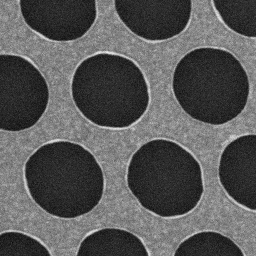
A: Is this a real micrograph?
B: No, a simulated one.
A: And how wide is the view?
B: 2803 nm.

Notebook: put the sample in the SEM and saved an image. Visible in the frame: holes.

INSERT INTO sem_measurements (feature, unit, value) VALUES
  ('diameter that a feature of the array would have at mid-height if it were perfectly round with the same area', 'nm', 843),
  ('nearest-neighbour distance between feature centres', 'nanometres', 1100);